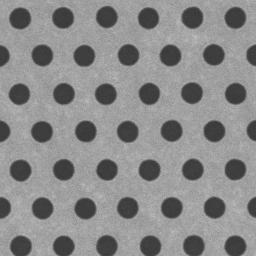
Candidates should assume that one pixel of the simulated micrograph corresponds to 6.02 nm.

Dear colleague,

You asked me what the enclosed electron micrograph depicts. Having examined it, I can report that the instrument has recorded a regular array of holes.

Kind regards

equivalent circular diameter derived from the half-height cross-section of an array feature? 0.129 micrometres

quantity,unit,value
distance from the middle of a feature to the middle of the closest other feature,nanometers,256